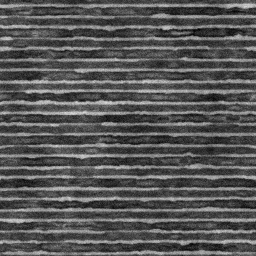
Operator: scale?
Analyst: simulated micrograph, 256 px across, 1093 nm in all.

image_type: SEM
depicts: parallel lines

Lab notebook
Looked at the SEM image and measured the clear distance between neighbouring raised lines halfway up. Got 8.76 pixels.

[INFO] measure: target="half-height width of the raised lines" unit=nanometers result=52.9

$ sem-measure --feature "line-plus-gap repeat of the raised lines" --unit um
0.0919